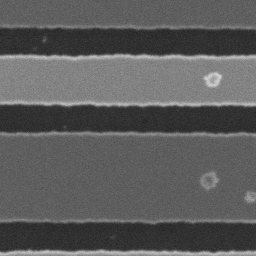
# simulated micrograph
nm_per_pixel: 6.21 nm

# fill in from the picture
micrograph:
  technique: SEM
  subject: lines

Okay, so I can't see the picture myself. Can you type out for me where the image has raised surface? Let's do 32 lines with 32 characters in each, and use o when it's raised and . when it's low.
oooooooooooooooooooooooooooooooo
oooooooooooooooooooooooooooooooo
oooooooooooooooooooooooooooooooo
.................ooo.oo...oo.ooo
................................
................................
................................
oooooooooooooooooooooooooooooooo
oooooooooooooooooooooooooooooooo
oooooooooooooooooooooooooooooooo
oooooooooooooooooooooooooooooooo
oooooooooooooooooooooooooooooooo
oooooooooooooooooooooooooooooooo
................................
................................
................................
................................
oooooooooooooooooooooooooooooooo
oooooooooooooooooooooooooooooooo
oooooooooooooooooooooooooooooooo
oooooooooooooooooooooooooooooooo
oooooooooooooooooooooooooooooooo
oooooooooooooooooooooooooooooooo
oooooooooooooooooooooooooooooooo
oooooooooooooooooooooooooooooooo
oooooooooooooooooooooooooooooooo
oooooooooooooooooooooooooooooooo
oooooooooooooooooooooooooooooooo
................................
................................
................................
.oooooooooooooo.oooooo.......ooo